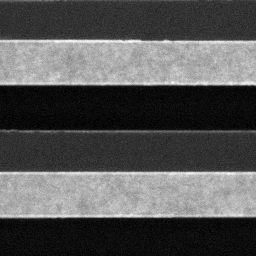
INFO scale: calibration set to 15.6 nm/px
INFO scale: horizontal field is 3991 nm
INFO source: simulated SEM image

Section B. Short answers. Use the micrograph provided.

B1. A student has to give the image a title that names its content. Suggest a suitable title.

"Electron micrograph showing lines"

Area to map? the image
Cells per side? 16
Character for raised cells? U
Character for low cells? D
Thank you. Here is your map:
UUUUUUUUUUUUUUUU
UUUUUUUUUUUUUUUU
UUUUUUUUUUUUUUUU
UUUUUUUUUUUUUUUU
UUUUUUUUUUUUUUUU
DDDDDDDDDDDDDDDD
DDDDDDDDDDDDDDDD
DDDDDDDDDDDDDDDD
UUUUUUUUUUUUUUUU
UUUUUUUUUUUUUUUU
UUUUUUUUUUUUUUUU
UUUUUUUUUUUUUUUU
UUUUUUUUUUUUUUUU
UUUUUUUUUUUUUUUU
DDDDDDDDDDDDDDDD
DDDDDDDDDDDDDDDD